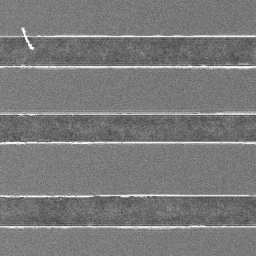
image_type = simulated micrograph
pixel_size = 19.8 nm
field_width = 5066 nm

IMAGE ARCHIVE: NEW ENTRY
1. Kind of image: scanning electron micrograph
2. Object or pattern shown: lines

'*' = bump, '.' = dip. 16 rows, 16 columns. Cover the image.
****************
****************
................
................
****************
****************
****************
................
................
****************
****************
****************
................
................
****************
****************